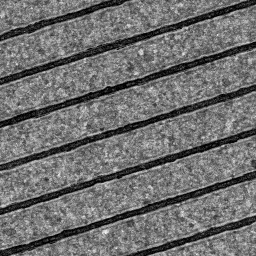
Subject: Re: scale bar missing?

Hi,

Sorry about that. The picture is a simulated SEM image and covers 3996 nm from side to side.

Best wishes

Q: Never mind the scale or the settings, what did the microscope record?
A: parallel lines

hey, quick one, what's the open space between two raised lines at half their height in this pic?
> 0.132 microns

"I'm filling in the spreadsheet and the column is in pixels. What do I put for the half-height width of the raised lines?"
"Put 32.8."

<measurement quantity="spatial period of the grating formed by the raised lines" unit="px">41.4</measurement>